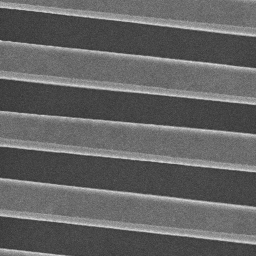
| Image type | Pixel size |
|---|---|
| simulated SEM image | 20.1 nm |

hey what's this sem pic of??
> lines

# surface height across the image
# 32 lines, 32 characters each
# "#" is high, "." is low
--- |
################################
.....###########################
..............##################
........................########
................................
####............................
#############...................
#####################...........
###############################.
################################
........########################
.................###############
...........................#####
................................
######..........................
#################...............
############################....
################################
...#############################
.............###################
......................##########
................................
##..............................
##########......................
###################.............
############################....
################################
.....###########################
..............##################
........................########
................................
####............................